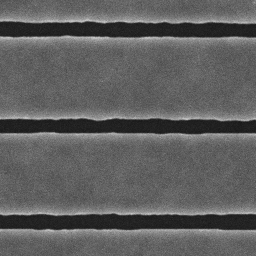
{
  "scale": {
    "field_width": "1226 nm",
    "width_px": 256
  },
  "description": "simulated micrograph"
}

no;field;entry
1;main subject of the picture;lines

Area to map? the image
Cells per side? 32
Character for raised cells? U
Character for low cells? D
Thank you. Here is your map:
UUUUUUUUUUUUUUUUUUUUUUUUUUUUUUUU
UUUUUUUUUUUUUUUUUUUUUUUUUUUUUUUU
UUUUUUUUUUUUUUUUUUUUUUUUUUUUUUUU
DDDDDDDDDDDDDDDDDDDDDDDDDDDDDDDD
DDDDDDDDDDDDDDDDDDDDDDDDDDDDDDDD
UUUUUUUUUUUUUUUUUUUUUUUUUUUUUUUU
UUUUUUUUUUUUUUUUUUUUUUUUUUUUUUUU
UUUUUUUUUUUUUUUUUUUUUUUUUUUUUUUU
UUUUUUUUUUUUUUUUUUUUUUUUUUUUUUUU
UUUUUUUUUUUUUUUUUUUUUUUUUUUUUUUU
UUUUUUUUUUUUUUUUUUUUUUUUUUUUUUUU
UUUUUUUUUUUUUUUUUUUUUUUUUUUUUUUU
UUUUUUUUUUUUUUUUUUUUUUUUUUUUUUUU
UUUUUUUUUUUUUUUUUUUUUUUUUUUUUUUU
UUUUUUUUUUUUUUUUUUUUUUUUUUUUUUUU
DDDDDDDDDDDDDDDDDDDDDDDDDDDDDDDD
DDDDDDDDDDDDDDDDDDDDDDDDDDDDDDDD
UUUUUUUUUUUUUUUUUUUUUUUUUUUUUUUU
UUUUUUUUUUUUUUUUUUUUUUUUUUUUUUUU
UUUUUUUUUUUUUUUUUUUUUUUUUUUUUUUU
UUUUUUUUUUUUUUUUUUUUUUUUUUUUUUUU
UUUUUUUUUUUUUUUUUUUUUUUUUUUUUUUU
UUUUUUUUUUUUUUUUUUUUUUUUUUUUUUUU
UUUUUUUUUUUUUUUUUUUUUUUUUUUUUUUU
UUUUUUUUUUUUUUUUUUUUUUUUUUUUUUUU
UUUUUUUUUUUUUUUUUUUUUUUUUUUUUUUU
UUUUUUUUUUUUUUUUUUUUUUUUUUUUUUUU
DDDDDDDDDDDDDDDDDDDDDDDDDDDDDDDD
DDDDDDDDDDDDDDDDDDDDDDDDDDDDDDDD
UUUUUUUUUUUUUUUUUUUUUUUUUUUUUUUU
UUUUUUUUUUUUUUUUUUUUUUUUUUUUUUUU
UUUUUUUUUUUUUUUUUUUUUUUUUUUUUUUU